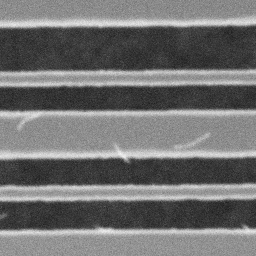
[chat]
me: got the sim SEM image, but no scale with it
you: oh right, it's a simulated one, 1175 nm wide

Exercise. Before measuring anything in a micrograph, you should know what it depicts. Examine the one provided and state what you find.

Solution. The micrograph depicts lines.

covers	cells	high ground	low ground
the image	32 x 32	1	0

11111111111111111111111111111111
11111111111111111111111111111111
11111111111111111111111111111111
00000000000000000000000000000000
00000000000000000000000000000000
00000000000000000000000000000000
00000000000000000000000000000000
00000000000000000000000000000000
00000000000000000000000000000000
11111111111111111111111111111111
11111111111111111111111111111111
00000000000000000000000000000000
00000000000000000000000000000000
00000000000000000000000000000000
11111111111111111111111111111111
11111111111111111111111111111111
11111111111111111111111111111111
11111111111111111111111111111111
11111111111111111111111111111111
11111111111111111111111111111111
00000000000000000000000000000000
00000000000000000000000000000000
00000000000000000000000000000000
11111111111111111111111111111111
11111111111111111111111111111111
00000000000000000000000000000000
00000000000000000000000000000000
00000000000000000000000000000000
00000000000000000000000000000000
11111111111111111111111111111111
11111111111111111111111111111111
11111111111111111111111111111111